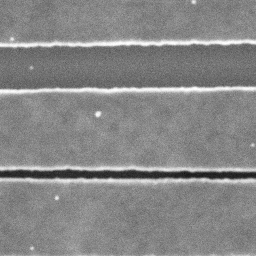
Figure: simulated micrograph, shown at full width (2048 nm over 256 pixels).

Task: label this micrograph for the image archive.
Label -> lines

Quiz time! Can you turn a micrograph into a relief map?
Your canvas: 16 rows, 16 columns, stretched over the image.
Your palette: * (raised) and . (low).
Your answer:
****************
****************
****************
................
................
............****
****************
****************
****************
****************
****************
****************
****************
****************
****************
****************